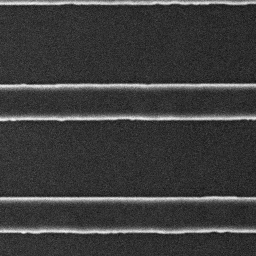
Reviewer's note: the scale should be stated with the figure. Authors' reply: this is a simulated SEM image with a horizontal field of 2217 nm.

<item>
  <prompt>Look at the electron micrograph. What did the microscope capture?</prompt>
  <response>lines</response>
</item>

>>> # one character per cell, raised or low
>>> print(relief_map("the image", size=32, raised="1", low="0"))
00000000000000000000000000000000
00000000000000000000000000000000
00000000000000000000000000000000
00000000000000000000000000000000
00000000000000000000000000000000
00000000000000000000000000000000
00000000000000000000000000000000
00000000000000000000000000000000
00000000000000000000000000000000
00000000000000000000000000000000
00000000000000000000000000000000
11111111111111111111111111111111
11111111111111111111111111111111
11111111111111111111111111111111
11111111111111111111111111111111
00000000000000000000000000000000
00000000000000000000000000000000
00000000000000000000000000000000
00000000000000000000000000000000
00000000000000000000000000000000
00000000000000000000000000000000
00000000000000000000000000000000
00000000000000000000000000000000
00000000000000000000000000000000
00000000000000000000000000000000
11111111111111111111111111111111
11111111111111111111111111111111
11111111111111111111111111111111
11111111111111111111111111111111
00000000000000000000000000000000
00000000000000000000000000000000
00000000000000000000000000000000